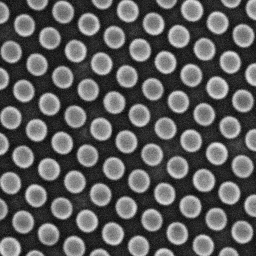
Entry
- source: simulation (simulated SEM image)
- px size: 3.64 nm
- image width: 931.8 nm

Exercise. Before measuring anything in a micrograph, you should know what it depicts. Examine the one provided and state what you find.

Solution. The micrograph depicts a regular array of raised bodies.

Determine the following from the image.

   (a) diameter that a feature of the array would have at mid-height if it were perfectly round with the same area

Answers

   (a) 76.1 nm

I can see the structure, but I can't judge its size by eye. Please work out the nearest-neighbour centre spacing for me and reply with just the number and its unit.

104 nm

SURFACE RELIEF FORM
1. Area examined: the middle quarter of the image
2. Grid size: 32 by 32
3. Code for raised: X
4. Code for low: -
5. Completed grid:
-------XXXXX-----------XXXXX--XX
X-------XXXX--XXXX------XXX---XX
XX-----------XXXXX-----------XXX
XX-----------XXXXX-----------XXX
XX--XXXX------XXXX--XXXX------XX
X---XXXX-------XX---XXXX--------
----XXXXX-----------XXXXX-------
----XXXX---XXX------XXXX---XXX--
-----XXX--XXXXX------XXX--XXXXX-
----------XXXXX-----------XXXXX-
----------XXXXX--XXX------XXXXX-
-XXXX------XXX---XXXX------XXX--
XXXXX-----------XXXXX-----------
XXXXX-----------XXXXX-----------
-XXXX--XXXX------XXXX--XXXX-----
--XX---XXXXX-----------XXXXX----
-------XXXXX-----------XXXXX----
X------XXXXX--XXX------XXXXX--XX
XX------XXX--XXXXX------XXX--XXX
XX-----------XXXXX-----------XXX
XX---XX------XXXXX---XX-------XX
X---XXXX------XXX---XXXX-------X
---XXXXX-----------XXXXXX-------
----XXXX----X-------XXXX---XX---
----XXXX--XXXX------XXXX--XXXX--
----------XXXXX-----------XXXXX-
----------XXXXX-----------XXXXX-
-XXX------XXXXX--XXXX------XXXX-
XXXXX-------XX--XXXXX-------X---
XXXXX-----------XXXXX-----------
XXXXX--XXX-------XXXX---XXX-----
-XXX---XXXX-------XX---XXXX-----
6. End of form